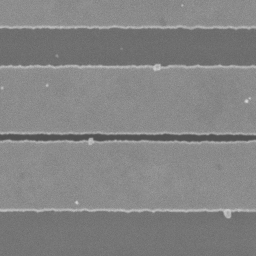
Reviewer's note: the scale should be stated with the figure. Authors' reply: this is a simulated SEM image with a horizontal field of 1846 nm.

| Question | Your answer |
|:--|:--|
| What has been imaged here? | lines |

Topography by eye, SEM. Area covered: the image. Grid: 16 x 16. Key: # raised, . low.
################
################
................
................
################
################
################
################
################
################
################
################
################
................
................
................